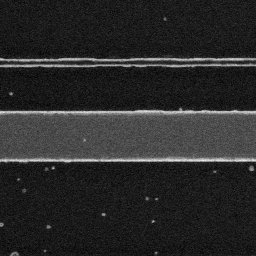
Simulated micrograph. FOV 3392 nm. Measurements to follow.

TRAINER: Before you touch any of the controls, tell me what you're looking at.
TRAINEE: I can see lines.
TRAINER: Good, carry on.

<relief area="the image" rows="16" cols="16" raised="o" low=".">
................
................
................
................
................
................
................
oooooooooooooooo
oooooooooooooooo
oooooooooooooooo
................
................
................
................
................
................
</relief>